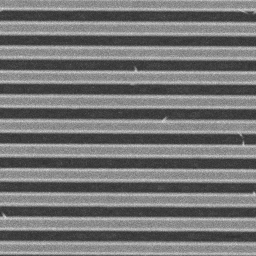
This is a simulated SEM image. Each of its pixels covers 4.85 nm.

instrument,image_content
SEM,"parallel lines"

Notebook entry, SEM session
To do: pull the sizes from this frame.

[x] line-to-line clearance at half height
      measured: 57.6 nm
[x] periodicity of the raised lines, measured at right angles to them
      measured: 118 nanometres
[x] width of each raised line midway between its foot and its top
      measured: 61.3 nanometers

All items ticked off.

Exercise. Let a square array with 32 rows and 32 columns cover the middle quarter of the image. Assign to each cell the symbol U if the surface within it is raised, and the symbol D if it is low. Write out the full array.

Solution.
DDDDDDDDDDDDDDDDDDDDDDDDDDDDDDDD
DDDDDDDDDDDDDDDDDDDDDDDDDDDDDDDD
UUUUUUUUUUUUUUUUUUUUUUUUUUUUUUUU
UUUUUUUUUUUUUUUUUUUUUUUUUUUUUUUU
UUUUUUUUUUUUUUUUUUUUUUUUUUUUUUUU
DDDDDDDDDDDDDDDDDDDDDDDDDDDDDDDD
DDDDDDDDDDDDDDDDDDDDDDDDDDDDDDDD
DDDDDDDDDDDDDDDDDDDDDDDDDDDDDDDD
UUUUUUUUUUUUUUUUUUUUUUUUUUUUUUUU
UUUUUUUUUUUUUUUUUUUUUUUUUUUUUUUU
UUUUUUUUUUUUUUUUUUUUUUUUUUUUUUUU
DDDDDDDDDDDDDDDDDDDDDDDDDDDDDDDD
DDDDDDDDDDDDDDDDDDDDDDDDDDDDDDDD
DDDDDDDDDDDDDDDDDDDDDDDDDDDDDDDD
UUUUUUUUUUUUUUUUUUUUUUUUUUUUUUUU
UUUUUUUUUUUUUUUUUUUUUUUUUUUUUUUU
UUUUUUUUUUUUUUUUUUUUUUUUUUUUUUUU
DDDDDDDDDDDDDDDDDDDDDDDDDDDDDDDD
DDDDDDDDDDDDDDDDDDDDDDDDDDDDDDDD
DDDDDDDDDDDDDDDDDDDDDDDDDDDDDDDD
UUUUUUUUUUUUUUUUUUUUUUUUUUUUUUUU
UUUUUUUUUUUUUUUUUUUUUUUUUUUUUUUU
UUUUUUUUUUUUUUUUUUUUUUUUUUUUUUUU
DDDDDDDDDDDDDDDDDDDDDDDDDDDDDDDD
DDDDDDDDDDDDDDDDDDDDDDDDDDDDDDDD
DDDDDDDDDDDDDDDDDDDDDDDDDDDDDDDD
UUUUUUUUUUUUUUUUUUUUUUUUUUUUUUUU
UUUUUUUUUUUUUUUUUUUUUUUUUUUUUUUU
UUUUUUUUUUUUUUUUUUUUUUUUUUUUUUUU
DDDDDDDDDDDDDDDDDDDDDDDDDDDDDDDD
DDDDDDDDDDDDDDDDDDDDDDDDDDDDDDDD
DDDDDDDDDDDDDDDDDDDDDDDDDDDDDDDD